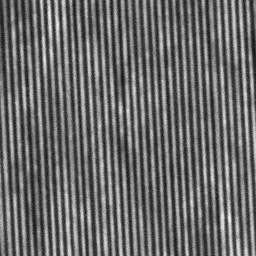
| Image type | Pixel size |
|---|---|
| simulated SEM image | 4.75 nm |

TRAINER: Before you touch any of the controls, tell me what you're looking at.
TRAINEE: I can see parallel lines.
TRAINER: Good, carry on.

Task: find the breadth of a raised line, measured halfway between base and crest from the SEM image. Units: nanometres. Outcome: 13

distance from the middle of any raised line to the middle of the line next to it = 34.9 nm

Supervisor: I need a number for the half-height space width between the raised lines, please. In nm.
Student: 21.3